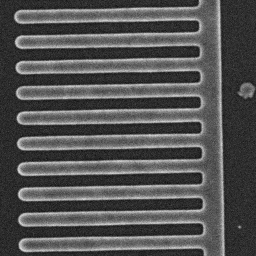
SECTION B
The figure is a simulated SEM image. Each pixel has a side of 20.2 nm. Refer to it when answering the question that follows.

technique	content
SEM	groups of lines, slits or small figures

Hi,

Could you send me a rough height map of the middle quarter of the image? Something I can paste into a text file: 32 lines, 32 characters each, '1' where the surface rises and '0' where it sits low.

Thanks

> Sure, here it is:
11111111111111111111111111111111
11111111111111111111111111111111
00000000000000000000000000000000
00000000000000000000000000000000
00000000000000000000000000000000
01111111111111111111111111111111
11111111111111111111111111111111
11111111111111111111111111111111
11111111111000000000000000000000
00000000000000000000000000000000
00000000000000000000000000000000
00000000000000000000011111111111
11111111111111111111111111111111
11111111111111111111111111111111
11111111111111111111111000000000
00000000000000000000000000000000
00000000000000000000000000000000
00000000000000000000000000000000
11111111111111111111111111111111
11111111111111111111111111111111
11111111111111111111111111111111
00000000000000000000000000000000
00000000000000000000000000000000
00000000000000000000000000000000
00001111111111111111111111111111
11111111111111111111111111111111
11111111111111111111111111111111
10000000000000000000000000000000
00000000000000000000000000000000
00000000000000000000000000000000
00000000000000000111111111111111
11111111111111111111111111111111